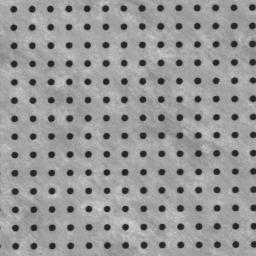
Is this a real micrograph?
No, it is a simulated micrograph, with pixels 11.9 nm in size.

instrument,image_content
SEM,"a regular array of holes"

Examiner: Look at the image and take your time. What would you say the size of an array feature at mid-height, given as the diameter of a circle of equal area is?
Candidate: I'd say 6.68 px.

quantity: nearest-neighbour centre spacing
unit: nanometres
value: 215